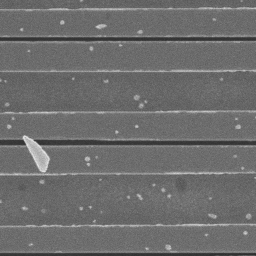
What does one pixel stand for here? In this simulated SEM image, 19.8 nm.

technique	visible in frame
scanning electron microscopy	lines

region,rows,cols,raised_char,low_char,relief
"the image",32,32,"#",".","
................................
################################
################################
################################
################################
################################
################################
################################
################################
................................
................................
................................
................................
................................
################################
################################
################################
...##....#..####################
################################
################################
################################
################################
................................
................................
................................
................................
................................
................................
################################
################################
################################
################################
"